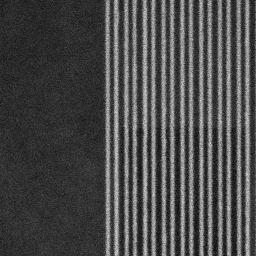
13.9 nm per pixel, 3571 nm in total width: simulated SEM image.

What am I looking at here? parallel lines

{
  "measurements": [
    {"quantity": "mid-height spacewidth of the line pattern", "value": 89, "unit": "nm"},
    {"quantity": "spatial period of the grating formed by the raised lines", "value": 130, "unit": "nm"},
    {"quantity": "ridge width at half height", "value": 2.37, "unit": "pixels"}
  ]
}